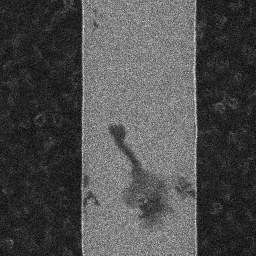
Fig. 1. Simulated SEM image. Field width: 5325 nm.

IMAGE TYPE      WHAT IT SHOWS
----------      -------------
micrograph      one or a few lines or trenches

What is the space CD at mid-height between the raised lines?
2340 nanometres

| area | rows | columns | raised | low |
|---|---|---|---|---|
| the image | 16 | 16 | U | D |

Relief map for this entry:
UUUUUDDDDDDDUUUU
UUUUUDDDDDDDUUUU
UUUUUDDDDDDDUUUU
UUUUUDDDDDDDUUUU
UUUUUDDDDDDDUUUU
UUUUUDDDDDDDUUUU
UUUUUDDDDDDDUUUU
UUUUUDDDDDDDUUUU
UUUUUDDDDDDDUUUU
UUUUUDDDDDDDUUUU
UUUUUDDDDDDDUUUU
UUUUUDDDDDDDUUUU
UUUUUDDDDDDDUUUU
UUUUUDDDDDDDUUUU
UUUUUDDDDDDDUUUU
UUUUUDDDDDDDUUUU